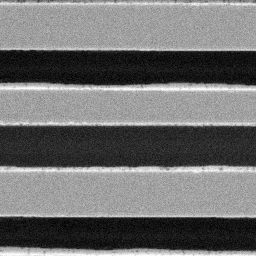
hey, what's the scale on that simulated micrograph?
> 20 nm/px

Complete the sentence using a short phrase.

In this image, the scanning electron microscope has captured lines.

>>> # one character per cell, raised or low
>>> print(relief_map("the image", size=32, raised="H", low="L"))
HHHHHHHHHHHHHHHHHHHHHHHHHHHHHHHH
HHHHHHHHHHHHHHHHHHHHHHHHHHHHHHHH
HHHHHHHHHHHHHHHHHHHHHHHHHHHHHHHH
HHHHHHHHHHHHHHHHHHHHHHHHHHHHHHHH
HHHHHHHHHHHHHHHHHHHHHHHHHHHHHHHH
HHHHHHHHHHHHHHHHHHHHHHHHHHHHHHHH
LLLLLLLLLLLLLLLLLLLLLLLLLLLLLLLL
LLLLLLLLLLLLLLLLLLLLLLLLLLLLLLLL
LLLLLLLLLLLLLLLLLLLLLLLLLLLLLLLL
LLLLLLLLLLLLLLLLLLLLLLLLLLLLLLLL
LLLLLLLLLLLLLLLLLLLLLLLLLLLLLLLL
HHHHHHHHHHHHHHHHHHHHHHHHHHHHHHHH
HHHHHHHHHHHHHHHHHHHHHHHHHHHHHHHH
HHHHHHHHHHHHHHHHHHHHHHHHHHHHHHHH
HHHHHHHHHHHHHHHHHHHHHHHHHHHHHHHH
LLLLLLLLLLLLLLLLLLLLLLLLLLLLLLLL
LLLLLLLLLLLLLLLLLLLLLLLLLLLLLLLL
LLLLLLLLLLLLLLLLLLLLLLLLLLLLLLLL
LLLLLLLLLLLLLLLLLLLLLLLLLLLLLLLL
LLLLLLLLLLLLLLLLLLLLLLLLLLLLLLLL
LLLLLLLLLLLLLLLLLLLLLLLLLLLLLLLL
HHHHHHHHHHHHHHHHHHHHHHHHHHHHHHHH
HHHHHHHHHHHHHHHHHHHHHHHHHHHHHHHH
HHHHHHHHHHHHHHHHHHHHHHHHHHHHHHHH
HHHHHHHHHHHHHHHHHHHHHHHHHHHHHHHH
HHHHHHHHHHHHHHHHHHHHHHHHHHHHHHHH
HHHHHHHHHHHHHHHHHHHHHHHHHHHHHHHH
LLLLLLLLLLLLLLLLLLLLLLLLLLLLLLLL
LLLLLLLLLLLLLLLLLLLLLLLLLLLLLLLL
LLLLLLLLLLLLLLLLLLLLLLLLLLLLLLLL
LLLLLLLLLLLLLLLLLLLLLLLLLLLLLLLL
LLLLLLLLLLLLLLLLLLLLLLLLLLLLLLLL